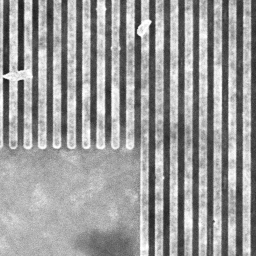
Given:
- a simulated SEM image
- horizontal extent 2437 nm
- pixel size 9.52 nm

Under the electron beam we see parallel lines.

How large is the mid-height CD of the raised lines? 0.075 um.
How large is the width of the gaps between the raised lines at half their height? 66.6 nm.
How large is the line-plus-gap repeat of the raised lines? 0.139 microns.